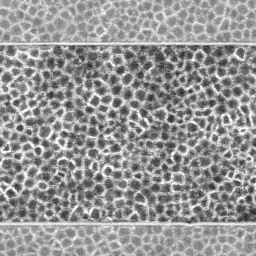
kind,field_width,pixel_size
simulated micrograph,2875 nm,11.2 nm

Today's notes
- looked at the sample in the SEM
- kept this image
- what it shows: one or a few lines or trenches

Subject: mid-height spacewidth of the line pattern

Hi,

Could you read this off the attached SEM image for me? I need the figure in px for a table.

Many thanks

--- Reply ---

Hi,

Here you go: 181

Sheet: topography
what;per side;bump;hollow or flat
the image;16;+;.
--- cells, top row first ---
++++++++++++++++
++++++++++++++++
++++++++++++++++
................
................
................
................
................
................
................
................
................
................
................
++++++++++++++++
++++++++++++++++